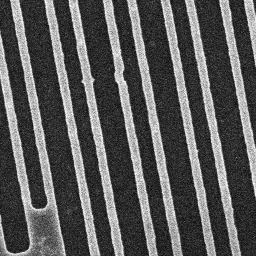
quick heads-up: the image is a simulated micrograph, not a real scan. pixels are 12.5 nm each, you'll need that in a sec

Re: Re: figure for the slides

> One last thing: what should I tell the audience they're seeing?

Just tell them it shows parallel lines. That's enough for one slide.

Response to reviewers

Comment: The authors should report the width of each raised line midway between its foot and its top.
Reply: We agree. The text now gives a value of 8 px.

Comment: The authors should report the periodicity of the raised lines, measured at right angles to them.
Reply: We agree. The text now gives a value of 359 nm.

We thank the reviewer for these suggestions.